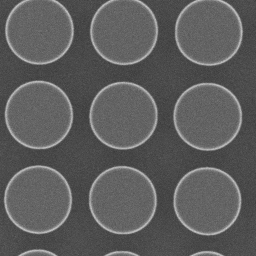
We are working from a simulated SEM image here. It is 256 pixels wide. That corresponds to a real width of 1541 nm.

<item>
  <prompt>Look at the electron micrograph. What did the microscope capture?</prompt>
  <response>an array of small figures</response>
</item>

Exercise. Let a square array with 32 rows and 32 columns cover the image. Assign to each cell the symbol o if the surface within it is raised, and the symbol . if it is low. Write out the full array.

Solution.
..oooooo.....ooooo......ooooo...
.ooooooo....ooooooo....ooooooo..
.oooooooo...oooooooo..oooooooo..
.oooooooo..ooooooooo..oooooooo..
.oooooooo..ooooooooo..oooooooo..
.oooooooo...ooooooo...oooooooo..
..oooooo....ooooooo....ooooooo..
...oooo......ooooo......oooo....
................................
................................
...oooo.......ooo........oo.....
..oooooo....oooooo.....oooooo...
.oooooooo...ooooooo...oooooooo..
.oooooooo..ooooooooo..oooooooo..
.oooooooo..ooooooooo..oooooooo..
.oooooooo..ooooooooo..oooooooo..
.ooooooo....ooooooo...oooooooo..
..oooooo....oooooo.....oooooo...
....oo........ooo.......oooo....
................................
................................
..ooooo......ooooo......oooo....
.ooooooo....ooooooo....oooooo...
.oooooooo..oooooooo...oooooooo..
.oooooooo..ooooooooo..oooooooo..
.oooooooo..ooooooooo..oooooooo..
.oooooooo..oooooooo...oooooooo..
.ooooooo....ooooooo...ooooooo...
...oooo......ooooo.....oooooo...
................................
................................
...ooo........oo.........oo.....